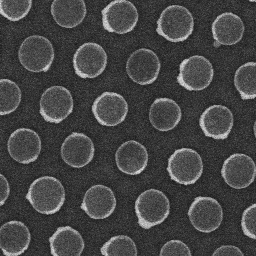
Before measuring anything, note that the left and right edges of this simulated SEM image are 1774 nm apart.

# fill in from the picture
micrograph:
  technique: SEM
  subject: a regular array of raised bodies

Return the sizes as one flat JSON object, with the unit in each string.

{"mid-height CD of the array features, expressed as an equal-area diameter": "239 nm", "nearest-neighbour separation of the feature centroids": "362 nm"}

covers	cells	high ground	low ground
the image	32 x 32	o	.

oooo...oooo...oo................
oooo...oooo..oooo...oooo........
.o.....ooo...oooo...oooo...ooo..
.............oooo...oooo...ooo..
....o...............oooo...ooo..
...ooo.....o................o...
..ooooo...ooo....oo.............
..ooooo..oooo...oooo...ooo......
...ooo...oooo...oooo..ooooo...oo
..........oo....oooo..ooooo..ooo
oo...............oo....ooo...ooo
ooo...ooo.....................oo
ooo..oooo...oooo...oo...........
oo...oooo...oooo...ooo....oo....
.....ooo....oooo...oooo..oooo...
.............oo....ooo...oooo...
..oo.....................oooo...
.oooo...ooo.....................
.oooo...oooo...ooo..............
.oooo...oooo..oooo...oooo....oo.
.........oo....ooo...oooo...oooo
................oo...oooo...oooo
o...ooo...............ooo...oooo
o...oooo...oo................o..
o..ooooo...ooo....ooo...........
....oooo..oooo...oooo...ooo.....
.....oo....ooo...oooo...oooo...o
.................ooo....oooo..oo
ooo....oo.........o......oo...oo
oooo..oooo.....................o
oooo..oooo...oooo....oo.........
ooo...oooo...oooo...oooo...ooo..